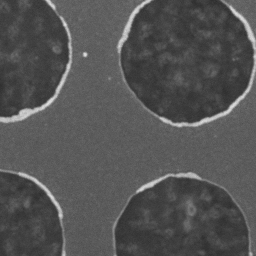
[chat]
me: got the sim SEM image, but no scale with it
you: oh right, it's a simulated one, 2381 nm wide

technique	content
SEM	holes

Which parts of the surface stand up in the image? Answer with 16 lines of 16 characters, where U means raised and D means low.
DDDUUUUUUDDDDDUU
DDDDUUUUDDDDDDDU
DDDDUUUUDDDDDDDD
DDDDUUUUDDDDDDDD
DDDDUUUUDDDDDDDD
DDDDUUUUDDDDDDDU
DDDUUUUUUDDDDDDU
UUUUUUUUUUUDDUUU
UUUUUUUUUUUUUUUU
UUUUUUUUUUUUUUUU
UUUUUUUUUUUUUUUU
DDUUUUUUUUDDDUUU
DDDUUUUUDDDDDDDU
DDDDUUUUDDDDDDDU
DDDDUUUDDDDDDDDD
DDDDUUUDDDDDDDDD